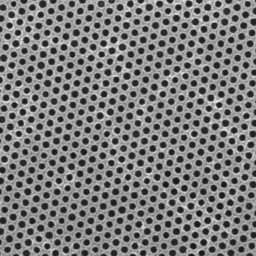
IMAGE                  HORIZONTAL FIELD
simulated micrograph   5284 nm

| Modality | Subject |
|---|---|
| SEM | a regular array of holes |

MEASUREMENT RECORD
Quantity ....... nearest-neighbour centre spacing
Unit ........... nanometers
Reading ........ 224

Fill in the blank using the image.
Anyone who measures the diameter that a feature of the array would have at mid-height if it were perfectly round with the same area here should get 156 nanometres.